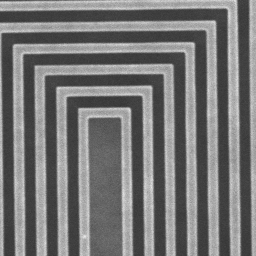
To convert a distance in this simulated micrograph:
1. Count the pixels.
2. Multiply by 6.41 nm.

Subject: groups of lines, slits or small figures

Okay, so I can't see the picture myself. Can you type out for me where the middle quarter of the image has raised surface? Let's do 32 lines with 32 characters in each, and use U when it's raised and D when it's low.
UUUUUUUUUUUUUUUUUUUUUUUUUUUDDDDU
UUUUUUUUUUUUUUUUUUUUUUUUUUUDDDDU
UUUUUUUUDDDDDDDDDDDDDDDDDUUDDDDU
DDDDDDDDDDDDDDDDDDDDDDDDDUUDDDDU
DDDDDDDDDDDDDDDDDDDDDDDDDUUDDDDU
DDDDDDDDDDDDDDDDDDDDUUDDDUUDDDDU
UUUUUUUUUUUUUUUUUUUUUUDDDUUDDDDU
UUUUUUUUUUUUUUUUUUUUUUDDDUUDDDDU
UDDDDDDDDDDDDDDDDDDDUUDDDUUDDDDU
DDDDDDDDDDDDDDDDDDDDUUDDDUUDDDDU
DDDDDDDDDDDDDDDDDDDDUUDDDUUDDDDU
DDDDUUUUUUUUUUUUDDDDUUDDDUUDDDDU
DDDDUUUUUUUUUUUUUDDDUUDDDUUDDDDU
DDDDUUDDDDDDDDUUUDDDUUDDDUUDDDDU
DDDDUUDDDDDDDDDUUDDDUUDDDUUDDDDU
DDDDUUDDDDDDDDDUUDDDUUDDDUUDDDDU
DDDDUUDDDDDDDDDUUDDDUUDDDUUDDDDU
DDDDUUDDDDDDDDDUUDDDUUDDDUUDDDDU
UDDDUUDDDDDDDDDUUDDDUUDDDUUDDDDU
UDDDUUDDDDDDDDDUUDDDUUDDDUUDDDDU
UDDDUUDDDDDDDDDUUDDDUUDDDUUDDDDU
UDDDUUDDDDDDDDDUUDDDUUDDDUUDDDDU
UDDDUUDDDDDDDDDUUDDDUUDDDUUDDDDU
UDDDUUDDDDDDDDDUUDDDUUDDDUUDDDDU
UDDDUUDDDDDDDDDUUDDDUUDDDUUDDDDU
UDDDUUDDDDDDDDDUUDDDUUDDDUUDDDDU
UDDDUUDDDDDDDDDUUDDDUUDDDUUDDDDU
UDDDUUDDDDDDDDDUUDDDUUDDDUUDDDDU
UDDDUUDDDDDDDDDUUDDDUUDDDUUDDDDU
UDDDUUDDDDDDDDDUUDDDUUDDDUUDDDDU
UDDDUUDDDDDDDDDUUDDDUUDDDUUUDDDU
UDDDUUDDDDDDDDDUUDDDUUDDDUUUDDDU